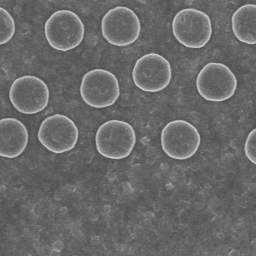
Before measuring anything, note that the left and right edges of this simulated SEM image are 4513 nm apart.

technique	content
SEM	a regular array of raised bodies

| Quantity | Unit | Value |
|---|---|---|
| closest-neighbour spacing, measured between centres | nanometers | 971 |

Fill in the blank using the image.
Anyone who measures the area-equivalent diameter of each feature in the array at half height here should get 664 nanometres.